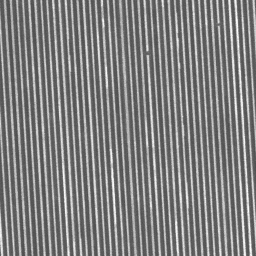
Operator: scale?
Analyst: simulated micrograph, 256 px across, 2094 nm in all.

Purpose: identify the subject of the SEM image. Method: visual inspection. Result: parallel lines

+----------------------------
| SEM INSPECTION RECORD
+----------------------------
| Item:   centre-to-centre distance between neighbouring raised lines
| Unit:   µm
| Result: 0.0495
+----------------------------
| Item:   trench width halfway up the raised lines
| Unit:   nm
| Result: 31.7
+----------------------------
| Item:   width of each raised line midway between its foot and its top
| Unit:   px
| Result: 1.87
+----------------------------